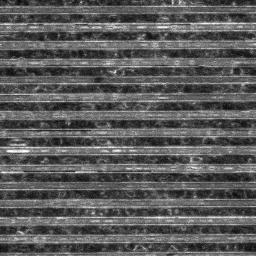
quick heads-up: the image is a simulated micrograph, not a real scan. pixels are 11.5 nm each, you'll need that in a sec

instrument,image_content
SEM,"parallel lines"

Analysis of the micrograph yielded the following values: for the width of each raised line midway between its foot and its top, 125 nm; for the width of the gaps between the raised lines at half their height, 0.0791 micrometres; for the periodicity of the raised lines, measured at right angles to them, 203 nm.